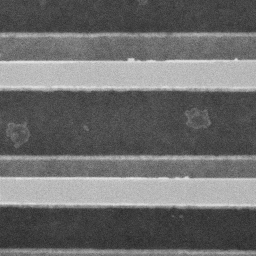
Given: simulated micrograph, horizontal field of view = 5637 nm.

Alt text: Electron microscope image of lines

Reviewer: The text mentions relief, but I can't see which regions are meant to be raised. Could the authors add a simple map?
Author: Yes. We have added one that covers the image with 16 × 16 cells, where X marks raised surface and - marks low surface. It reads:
----------------
----------------
XXXXXXXXXXXXXXXX
XXXXXXXXXXXXXXXX
XXXXXXXXXXXXXXXX
XXXXXXXXXXXXXXXX
----------------
----------------
----------------
----------------
XXXXXXXXXXXXXXXX
XXXXXXXXXXXXXXXX
XXXXXXXXXXXXXXXX
----------------
----------------
----------------